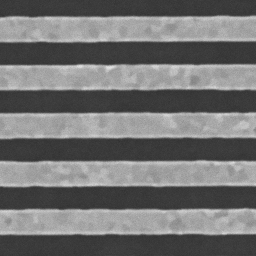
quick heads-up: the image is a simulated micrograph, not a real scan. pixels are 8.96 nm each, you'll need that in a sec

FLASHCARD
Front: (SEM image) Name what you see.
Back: wiring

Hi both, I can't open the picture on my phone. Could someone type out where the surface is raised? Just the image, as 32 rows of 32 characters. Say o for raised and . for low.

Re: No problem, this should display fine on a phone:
................................
................................
oooooooooooooooooooooooooooooooo
oooooooooooooooooooooooooooooooo
oooooooooooooooooooooooooooooooo
................................
................................
................................
oooooooooooooooooooooooooooooooo
oooooooooooooooooooooooooooooooo
oooooooooooooooooooooooooooooooo
................................
................................
................................
oooooooooooooooooooooooooooooooo
oooooooooooooooooooooooooooooooo
oooooooooooooooooooooooooooooooo
................................
................................
................................
oooooooooooooooooooooooooooooooo
oooooooooooooooooooooooooooooooo
oooooooooooooooooooooooooooooooo
................................
................................
................................
oooooooooooooooooooooooooooooooo
oooooooooooooooooooooooooooooooo
oooooooooooooooooooooooooooooooo
................................
................................
................................